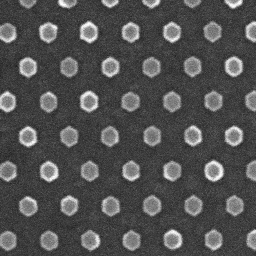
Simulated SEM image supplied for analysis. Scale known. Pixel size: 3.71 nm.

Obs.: a regular array of raised bodies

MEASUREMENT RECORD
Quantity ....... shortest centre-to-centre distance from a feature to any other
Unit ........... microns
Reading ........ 0.149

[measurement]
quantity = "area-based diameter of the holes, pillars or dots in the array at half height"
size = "17.8 pixels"